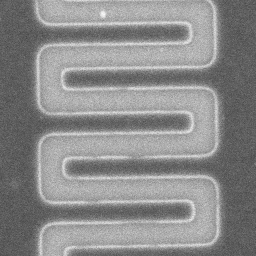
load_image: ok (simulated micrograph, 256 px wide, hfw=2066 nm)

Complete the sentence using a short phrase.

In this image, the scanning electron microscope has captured groups of lines, slits or small figures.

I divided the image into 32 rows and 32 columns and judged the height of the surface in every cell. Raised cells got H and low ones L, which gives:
HHHHHLLLLLLLLLLLLLLLLLLLLLHHHHHH
HHHHHLLLLLLLLLLLLLLLLLLLLLLHHHHH
HHHHHLLLLLLLLLLLLLLLLLLLLLLHHHHH
HHHHHHHHHHHHHHHHHHHHHHHHLLLHHHHH
HHHHHHHHHHHHHHHHHHHHHHHHLLLHHHHH
HHHHHHHHHHHHHHHHHHLLLLLLLLLHHHHH
HHHHHLLLLLLLLLLLLLLLLLLLLLLHHHHH
HHHHHLLLLLLLLLLLLLLLLLLLLLLHHHHH
HHHHHLLLLLLLHHHHHHHHHHHHHHHHHHHH
HHHHHLLLHHHHHHHHHHHHHHHHHHHHHHHH
HHHHHLLLHHHHHHHHHHHHHHHHHHHHHHHH
HHHHHLLLLLLLLLLLLLLLLLLLLLHHHHHH
HHHHHLLLLLLLLLLLLLLLLLLLLLLHHHHH
HHHHHLLLLLLLLLLLLLLLLLLLLLLHHHHH
HHHHHHHHHHHHHHHHHHHHHHHHLLLHHHHH
HHHHHHHHHHHHHHHHHHHHHHHHLLLHHHHH
HHHHHHHHHHHHHHHHHHHHHHHHLLLHHHHH
HHHHHLLLLLLLLLLLLLLLLLLLLLLHHHHH
HHHHHLLLLLLLLLLLLLLLLLLLLLLHHHHH
HHHHHLLLLLLLLLLLLLLLLLLHHHHHHHHH
HHHHHLLLHHHHHHHHHHHHHHHHHHHHHHHH
HHHHHLLLHHHHHHHHHHHHHHHHHHHHHHHH
HHHHHLLLLLLLLLLLLLLLLLLLLLHHHHHH
HHHHHLLLLLLLLLLLLLLLLLLLLLLHHHHH
HHHHHLLLLLLLLLLLLLLLLLLLLLLHHHHH
HHHHHHHHHHHHHHHHHHHHHHHHLLLHHHHH
HHHHHHHHHHHHHHHHHHHHHHHHLLLHHHHH
HHHHHHHHHHHHHHHHHHHHHHHHLLLHHHHH
HHHHHHLLLLLLLLLLLLLLLLLLLLLHHHHH
HHHHHLLLLLLLLLLLLLLLLLLLLLLHHHHH
HHHHHLLLLLLLLLLLLLLLLLLLLLHHHHHH
HHHHHLLLHHHHHHHHHHHHHHHHHHHHHHHH